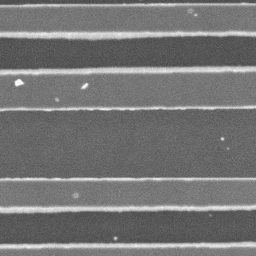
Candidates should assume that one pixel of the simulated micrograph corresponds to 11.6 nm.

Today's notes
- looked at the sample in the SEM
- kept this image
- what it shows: lines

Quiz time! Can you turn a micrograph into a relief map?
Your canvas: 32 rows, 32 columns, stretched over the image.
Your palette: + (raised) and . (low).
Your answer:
................................
++++++++++++++++++++++++++++++++
++++++++++++++++++++++++++++++++
++++++++++++++++++++++++++++++++
................................
................................
................................
................................
................................
++++++++++++++++++++++++++++++++
++++++++++++++++++++++++++++++++
++++++++++++++++++++++++++++++++
++++++++++++++++++++++++++++++++
+++++++++++++++++++++++...+.....
................................
................................
................................
................................
................................
................................
................................
................................
++++++++++++++++++++++++++++++++
++++++++++++++++++++++++++++++++
++++++++++++++++++++++++++++++++
++++++++++++++++++++++++++++++++
................................
................................
................................
................................
................................
++++++++++++++++++++++++++++++++